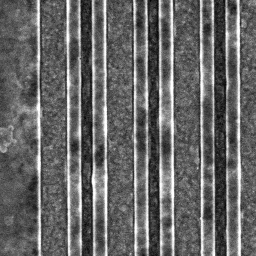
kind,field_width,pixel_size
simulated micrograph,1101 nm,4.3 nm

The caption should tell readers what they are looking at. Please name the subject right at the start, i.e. parallel lines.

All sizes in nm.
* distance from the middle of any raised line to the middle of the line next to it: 137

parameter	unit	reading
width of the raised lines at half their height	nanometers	55.4